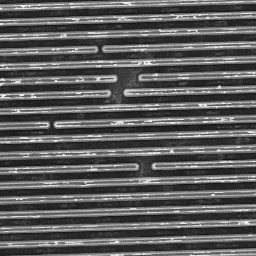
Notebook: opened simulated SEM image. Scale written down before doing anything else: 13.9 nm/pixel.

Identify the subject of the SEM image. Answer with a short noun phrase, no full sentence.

parallel lines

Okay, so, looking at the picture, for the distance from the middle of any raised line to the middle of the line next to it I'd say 206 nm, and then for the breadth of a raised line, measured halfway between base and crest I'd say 74.8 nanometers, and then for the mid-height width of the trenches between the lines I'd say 127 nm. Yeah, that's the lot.